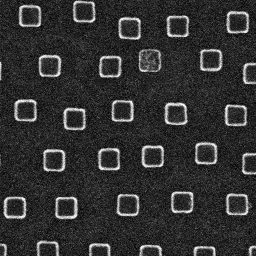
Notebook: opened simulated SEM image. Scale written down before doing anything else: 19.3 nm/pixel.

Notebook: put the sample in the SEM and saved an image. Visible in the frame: a regular array of raised bodies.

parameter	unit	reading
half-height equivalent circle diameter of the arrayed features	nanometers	427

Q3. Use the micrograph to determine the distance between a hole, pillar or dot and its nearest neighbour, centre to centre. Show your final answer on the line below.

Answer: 48.2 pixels